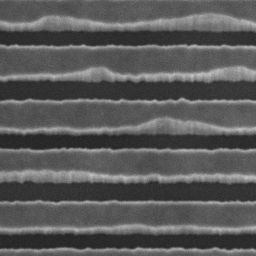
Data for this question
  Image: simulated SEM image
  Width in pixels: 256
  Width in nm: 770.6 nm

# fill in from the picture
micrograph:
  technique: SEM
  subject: lines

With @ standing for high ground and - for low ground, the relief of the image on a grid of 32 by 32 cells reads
@@@@@@@@@@@@@@@@@@@@@@@@@@@@@@@@
@@@@@@@@@@@@@@@@@@@@@@@@@@@@@@@@
@@@@@@@@@@@@@@@@@@@@@@@@@@@@@@@@
-@@@-------@@@@@@@-------------@
--------------------------------
--------------------------------
@@@@@@@@@@@@@@@@@@@@@@@@@@@@@@@@
@@@@@@@@@@@@@@@@@@@@@@@@@@@@@@@@
@@@@@@@@@@@@@@@@@@@@@@@@@@@@@@@@
@@@@@@@@@@@@@@@@@@@@@@@@@@@----@
--------------------------------
--------------------------------
---@-----@@@@--@------@---------
@@@@@@@@@@@@@@@@@@@@@@@@@@@@@@@@
@@@@@@@@@@@@@@@@@@@@@@@@@@@@@@@@
@@@@@@@@@@@@@@@@@@@@@@@@@@@@@@@@
-@@@@@@-@@@@@@@------------@@@@@
--------------------------------
--------------------------------
@@@@@@@@@@@@@@@@@@@@@@@@@@@@@@@@
@@@@@@@@@@@@@@@@@@@@@@@@@@@@@@@@
@@@@@@@@@@@@@@@@@@@@@@@@@@@@@@@@
--------------@@-@--@@------@-@-
--------------------------------
--------------------------------
@@@@@@@@@@@@@@@@@@@@@@@@@@@@@@@@
@@@@@@@@@@@@@@@@@@@@@@@@@@@@@@@@
@@@@@@@@@@@@@@@@@@@@@@@@@@@@@@@@
@@@@@@@@@@@@@@@@@@@@@@@@@@@@@@@@
--------------------------------
--------------------------------
@@@@@@@@@@@@@@@@@@@@@@@@@@@@@@@@